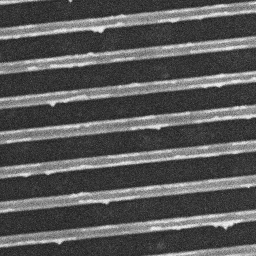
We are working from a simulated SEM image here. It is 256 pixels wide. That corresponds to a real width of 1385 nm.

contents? parallel lines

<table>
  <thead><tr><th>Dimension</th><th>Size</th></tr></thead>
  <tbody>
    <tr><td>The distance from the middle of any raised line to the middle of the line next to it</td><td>0.187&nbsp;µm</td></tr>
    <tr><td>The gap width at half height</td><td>0.128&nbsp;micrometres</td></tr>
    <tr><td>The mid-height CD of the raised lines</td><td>0.0584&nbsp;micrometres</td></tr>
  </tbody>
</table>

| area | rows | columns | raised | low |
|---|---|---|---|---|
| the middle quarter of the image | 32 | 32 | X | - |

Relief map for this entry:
XXXXX---------------------------
--------------------------------
--------------------------------
--------------------------------
----------------------XXXXXXXXXX
--------------XXXXXXXXXXXXXXXXXX
---XXXXXXXXXXXXXXXXXXXXXXXX-----
XXXXXXXXXXXXXXXXXX--------------
XXXXXXXXX-----------------------
X-------------------------------
--------------------------------
--------------------------------
----------------------------XXXX
-------------------XXXXXXXXXXXXX
---------XXXXXXXXXXXXXXXXXXXXXXX
XXXXXXXXXXXXXXXXXXXXXXXXXX------
XXXXXXXXXXXXXXXX----------------
XXXXX---------------------------
--------------------------------
--------------------------------
--------------------------------
---------------------------XXXXX
-----------------XXXXXXXXXXXXXXX
--------XXXXXXXXXXXXXXXXXXXXXX--
XXXXXXXXXXXXXXXXXXXXX-----------
XXXXXXXXXXX---------------------
XX------------------------------
--------------------------------
--------------------------------
--------------------------------
------------------------XXXXXXXX
--------------XXXXXXXXXXXXXXXXXX